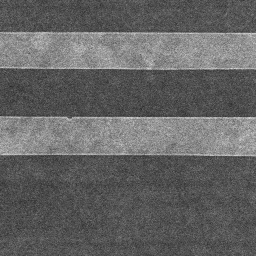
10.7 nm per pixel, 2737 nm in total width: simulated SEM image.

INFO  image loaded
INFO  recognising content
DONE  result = one or a few lines or trenches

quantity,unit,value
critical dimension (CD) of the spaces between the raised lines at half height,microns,0.528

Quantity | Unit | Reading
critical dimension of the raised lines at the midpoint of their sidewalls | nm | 378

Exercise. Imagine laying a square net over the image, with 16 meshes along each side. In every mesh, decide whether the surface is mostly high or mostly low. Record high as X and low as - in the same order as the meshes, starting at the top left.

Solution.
----------------
----------------
XXXXXXXXXXXXXXXX
XXXXXXXXXXXXXXXX
----------------
----------------
----------------
XXXXXXXXXXXXXXXX
XXXXXXXXXXXXXXXX
XXXXXXXXXXXXXXXX
----------------
----------------
----------------
----------------
----------------
----------------